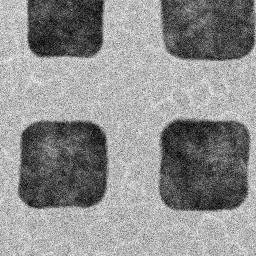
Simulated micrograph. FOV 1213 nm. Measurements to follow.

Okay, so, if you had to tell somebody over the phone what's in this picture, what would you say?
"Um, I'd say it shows holes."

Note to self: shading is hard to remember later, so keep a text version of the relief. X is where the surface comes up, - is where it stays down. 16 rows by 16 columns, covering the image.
XX----XXXX------
XX----XXXX------
XX----XXXX------
XX----XXXXX----X
XXXXXXXXXXXXXXXX
XXXXXXXXXXXXXXXX
XXXXXXXXXXXXXXXX
XXXXXXXXXXX---XX
X------XXX------
X------XXX------
X------XXX-----X
X------XXX-----X
X-----XXXX-----X
XXXXXXXXXXXXXXXX
XXXXXXXXXXXXXXXX
XXXXXXXXXXXXXXXX